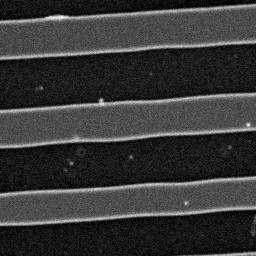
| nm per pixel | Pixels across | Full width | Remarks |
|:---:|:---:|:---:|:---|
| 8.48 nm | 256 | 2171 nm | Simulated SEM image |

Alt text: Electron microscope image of groups of lines, slits or small figures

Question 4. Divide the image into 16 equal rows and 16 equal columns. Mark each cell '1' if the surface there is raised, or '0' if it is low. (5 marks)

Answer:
0000000000000111
1111111111111111
1111111111111111
1111000000000000
0000000000000000
0000000000000000
0000001111111111
1111111111111111
1111111111000000
0000000000000000
0000000000000000
0000000001111111
1111111111111111
1111111110000000
0000000000000000
0000000000000000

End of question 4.